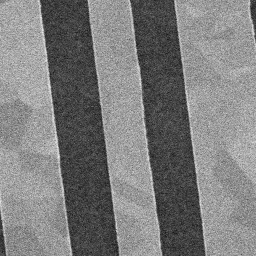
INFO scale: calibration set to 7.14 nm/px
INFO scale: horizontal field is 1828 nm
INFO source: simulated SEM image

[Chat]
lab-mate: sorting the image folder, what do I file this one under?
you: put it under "one or a few lines or trenches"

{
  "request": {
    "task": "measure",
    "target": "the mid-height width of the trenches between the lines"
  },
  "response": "336 nm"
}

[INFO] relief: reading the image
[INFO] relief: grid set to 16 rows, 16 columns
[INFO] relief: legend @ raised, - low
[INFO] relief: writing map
@@@---@@---@@@@@
@@@---@@---@@@@@
@@@---@@---@@@@@
@@@---@@@--@@@@@
@@@---@@@--@@@@@
@@@---@@@---@@@@
@@@---@@@---@@@@
@@@---@@@---@@@@
@@@@---@@---@@@@
@@@@---@@---@@@@
@@@@---@@---@@@@
@@@@---@@@--@@@@
@@@@---@@@--@@@@
@@@@---@@@---@@@
@@@@---@@@---@@@
@@@@---@@@---@@@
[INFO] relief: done